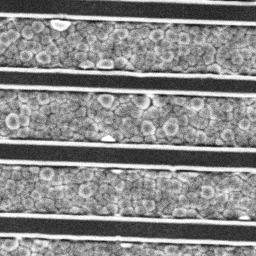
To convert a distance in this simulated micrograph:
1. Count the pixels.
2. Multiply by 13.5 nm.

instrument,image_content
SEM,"one or a few lines or trenches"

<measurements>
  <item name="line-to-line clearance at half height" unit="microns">0.73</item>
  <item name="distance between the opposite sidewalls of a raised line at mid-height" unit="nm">269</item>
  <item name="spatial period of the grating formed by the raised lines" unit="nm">983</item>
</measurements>